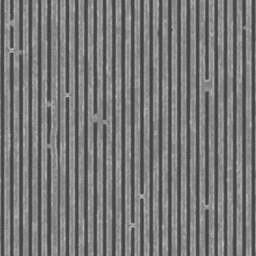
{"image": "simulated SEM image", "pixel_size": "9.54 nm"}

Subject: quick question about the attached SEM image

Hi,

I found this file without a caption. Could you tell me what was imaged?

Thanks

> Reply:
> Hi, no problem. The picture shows parallel lines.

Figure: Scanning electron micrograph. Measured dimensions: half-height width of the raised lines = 50.1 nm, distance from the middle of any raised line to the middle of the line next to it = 88.6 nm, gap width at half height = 4.12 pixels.